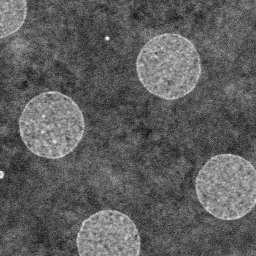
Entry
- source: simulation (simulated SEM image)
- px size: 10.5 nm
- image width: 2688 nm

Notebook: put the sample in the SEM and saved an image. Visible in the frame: raised bodies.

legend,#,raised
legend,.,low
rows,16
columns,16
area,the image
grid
##..............
#...............
..........##....
.........###....
.........###....
.........###....
..###...........
.####...........
.####...........
..##............
.............###
............####
............####
......##......#.
.....####.......
.....####.......